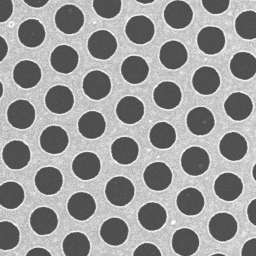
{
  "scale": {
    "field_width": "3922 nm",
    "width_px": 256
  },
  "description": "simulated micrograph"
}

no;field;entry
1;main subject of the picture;a regular array of holes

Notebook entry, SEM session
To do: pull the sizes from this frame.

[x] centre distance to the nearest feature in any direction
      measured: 619 nm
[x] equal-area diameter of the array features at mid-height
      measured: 441 nm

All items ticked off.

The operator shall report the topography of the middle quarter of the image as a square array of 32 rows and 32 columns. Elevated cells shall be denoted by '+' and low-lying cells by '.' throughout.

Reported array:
...+++++++++++.......++++.....++
...++++.++++++.......++++++.++++
.+++++.....+++.......+++++++++++
+++++......++++......+++++++++++
+++++.......++++....++++...+++++
+++++.......+++++++++++......+++
..+++.......++++++++++.......+++
..+++......+++++++++++.......+++
...+++....+++++...++++.......+++
..++++++++++++.....++++......+++
..+++++++++++.......++++....++++
..+++++++++++.......++++++++++++
+++++....++++.......+++++++++++.
++++......+++......++++++++++++.
+++.......+++++...++++++.++++++.
+++........+++++++++++.....++++.
++++......++++++++++++......+++.
.+++......+++++++++++.......++++
.+++++..++++++...++++.......++++
.+++++++++++......++++......++++
.+++++++++++.......+++.....+++++
++++++++++++.......+++++++++++..
++++....++++.......+++++++++++..
+++......+++......+++++++++++...
++.......++++....++++++.+++++...
++.......++++++++++++.....+++...
++.......+++++++++++.......+++..
+++......+++++++++++.......++++.
++++....++++....++++.......+++++
+++++++++++......+++.......+++++
++++++++++........+++.....++++++
++++++++++........++++...+++++..